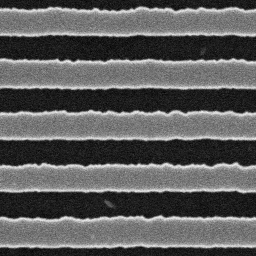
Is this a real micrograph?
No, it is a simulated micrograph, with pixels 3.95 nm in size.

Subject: lines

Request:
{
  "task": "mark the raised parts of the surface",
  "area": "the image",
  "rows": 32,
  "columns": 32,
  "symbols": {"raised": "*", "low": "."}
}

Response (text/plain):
................................
********************************
********************************
********************************
.****.......*****.............**
................................
................................
**.*..........**..*..........*..
********************************
********************************
********************************
................................
................................
................................
********************************
********************************
********************************
..................*.*...........
................................
................................
................................
********************************
********************************
********************************
................................
................................
................................
********************************
********************************
********************************
********************************
................................